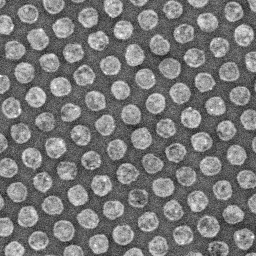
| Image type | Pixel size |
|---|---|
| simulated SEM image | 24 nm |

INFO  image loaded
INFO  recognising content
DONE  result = a regular array of raised bodies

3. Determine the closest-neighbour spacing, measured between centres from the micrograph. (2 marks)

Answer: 0.624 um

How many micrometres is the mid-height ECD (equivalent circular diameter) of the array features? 0.445